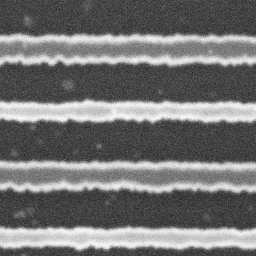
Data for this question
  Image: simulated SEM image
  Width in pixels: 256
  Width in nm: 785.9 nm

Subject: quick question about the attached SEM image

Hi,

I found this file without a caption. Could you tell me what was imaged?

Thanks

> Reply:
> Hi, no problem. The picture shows lines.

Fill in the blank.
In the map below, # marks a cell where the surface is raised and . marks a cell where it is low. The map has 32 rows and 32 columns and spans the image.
................................
................................
................................
................................
................................
################################
################################
################################
................................
................................
................................
................................
................................
################################
################################
................................
................................
................................
................................
................................
########...##.##.##.##.##.......
################################
################################
..####...#.......#####..###.####
................................
................................
................................
................................
................................
################################
################################
................................